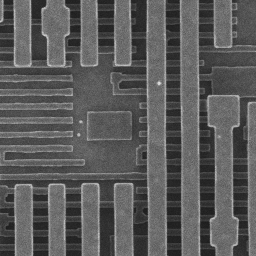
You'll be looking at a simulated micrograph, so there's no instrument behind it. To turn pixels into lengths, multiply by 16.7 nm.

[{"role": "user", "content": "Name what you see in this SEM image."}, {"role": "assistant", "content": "wiring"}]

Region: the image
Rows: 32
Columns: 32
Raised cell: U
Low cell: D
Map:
DDUUDDUUDDUUDDUUDDUUUDDUUDDUUDDD
DDUUDUUUUDUUDDUUDDUUUDDUUDDUUDDD
DDUUDUUUUDUUDDUUDDUUUDDUUDDUUDDD
DDUUDUUUUDUUDDUUDDUUUDDUUDDUUDDD
DDUUDDUUDDUUDDUUDDUUUDDUUDDUUDDD
DDUUDDUUDDUUDDUUDDUUUDDUUDDUUDDD
DDUUDDUUDDUUDDUUDDUUUDDUUDDDDDDD
DDUUDDUUDDUUDDUUDDUUUDDUUDDDDDDD
DDDDDDDDDDDDDDDDDDUUUDDUUDDDDDDD
DDDDDDDDDDDDDDDDDDUUUDDUUDDDDDDD
DDDDDDDDDDDDDDDDDDUUUDDUUDDDDDDD
DDDDDDDDDDDDDDDDDDUUUDDUUDDDDDDD
DDDDDDDDDDDDDDDDDDUUUDDUUDUUUUDD
DDDDDDDDDDDDDDDDDDUUUDDUUDUUUUDU
DDDDDDDDDDDDDDDDDDUUUDDUUDUUUUDU
DDDDDDDDDDDDDDDDDDUUUDDUUDUUUUDU
DDDDDDDDDDDDDDDDDDUUUDDUUDDUUDDU
DDDDDDDDDDDDDDDDDDUUUDDUUDDUUDDU
DDDDDDDDDDDDDDDDDDUUUDDUUDDUUDDU
DDDDDDDDDDDDDDDDDDUUUDDUUDDUUDDU
DDDDDDDDDDDDDDDDDDUUUDDUUDDUUDDU
DDDDDDDDDDDDDDDDDDUUUDDUUDDUUDDU
DDDDDDDDDDDDDDDDDDUUUDDUUDDUUDDU
DDUUDDUUDDUUDDUUUDUUUDDUUDDUUDDU
DDUUDDUUDDUUDDUUUDDUUDDUUDDUUDDU
DDUUDDUUDDUUDDUUUDDUUDDUUDDUUDDU
DDUUDDUUDDUUDDUUUDDUUDDUUDDUUDDU
DDUUDDUUDDUUDDUUUDDUUDDUUDUUUUDU
DDUUDDUUDDUUDDUUUDDUUDDUUDUUUUDU
DDUUDDUUDDUUDDUUUDDUUDDUUDUUUUDU
DDUUDDUUDDUUDDUUUDDUUDDUUDDUUUDU
DDUUDDUUDDUUDDUUUDDUUDDUUDDUUDDU